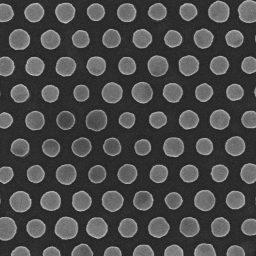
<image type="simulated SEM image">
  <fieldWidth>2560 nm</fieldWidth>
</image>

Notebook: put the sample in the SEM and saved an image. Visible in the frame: a regular array of raised bodies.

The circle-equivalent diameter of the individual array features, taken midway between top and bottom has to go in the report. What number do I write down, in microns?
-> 0.189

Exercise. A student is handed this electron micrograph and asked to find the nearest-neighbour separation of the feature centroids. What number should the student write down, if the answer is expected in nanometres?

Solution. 306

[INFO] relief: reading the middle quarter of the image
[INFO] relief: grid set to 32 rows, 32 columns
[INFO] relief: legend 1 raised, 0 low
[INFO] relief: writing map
11100011110000111100011111000111
11100011110000111100011111000111
11000001100000010000001110000011
00000000000000000000000000000000
00000000000000000000000000000000
00011000001111000111100001111000
00011100001111000111110001111100
00011100001111000111110001111100
00011100001111000111110001111000
00000000000110000001100000010000
00000000000000000000000000000000
00000000000000000000000000000000
11000011110000011000001110000011
11100011111000111100011111000111
11100011111000111100011111000111
11000011110000011000001110000111
00000001100000000000000000000000
00000000000000000000000000000000
00000000000000000000000000100000
00111100001111000011100001111100
00111110001111000011110001111100
00111110001111000011110001111100
00011100000110000011100000111000
00000000000000000000000000000000
00000000000000000000000000000000
11000000100000011000000110000001
11100001110000111100001111000111
11100011110000111100001111000111
11100011110000111100001111000111
11000001100000011000000110000000
00000000000000000000000000000000
00000000000000000000000000000000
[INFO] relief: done